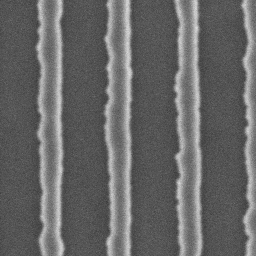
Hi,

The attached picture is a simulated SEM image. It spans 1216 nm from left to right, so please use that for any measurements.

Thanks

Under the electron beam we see lines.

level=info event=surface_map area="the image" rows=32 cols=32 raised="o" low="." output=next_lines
.....ooo......oo......ooo.....oo
.....ooo......oo......ooo......o
.....oo.......oo......ooo......o
.....oo.......oo......ooo......o
.....ooo.....ooo......ooo......o
.....ooo.....ooo......ooo......o
.....ooo......oo......ooo......o
.....ooo......oo......ooo......o
.....ooo.....ooo......ooo......o
.....ooo......oo......ooo......o
.....ooo......oo......ooo......o
.....ooo.....ooo......ooo......o
.....ooo......oo......ooo......o
.....ooo.....ooo......ooo......o
.....ooo.....ooo......ooo......o
.....ooo.....ooo......ooo......o
.....ooo.....ooo......ooo......o
.....ooo.....ooo.......oo......o
.....ooo......oo.......oo......o
.....ooo......oo......ooo......o
.....ooo......oo......ooo......o
.....ooo......oo.......oo......o
.....ooo......oo......ooo......o
.....ooo......oo......ooo......o
.....ooo......oo......ooo......o
.....ooo......oo......ooo......o
.....ooo......oo......ooo......o
.....ooo......oo......ooo......o
.....ooo......oo......ooo......o
.....ooo......oo......ooo......o
.....ooo.....ooo.......oo......o
.....ooo......oo.......oo......o